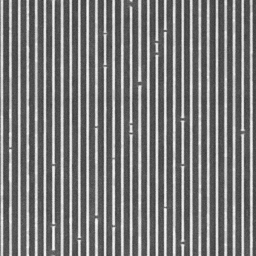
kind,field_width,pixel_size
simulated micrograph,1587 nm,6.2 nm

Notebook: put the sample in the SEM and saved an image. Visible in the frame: parallel lines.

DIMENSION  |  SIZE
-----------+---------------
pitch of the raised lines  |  53.3 nm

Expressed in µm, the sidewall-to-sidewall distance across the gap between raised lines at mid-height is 0.0403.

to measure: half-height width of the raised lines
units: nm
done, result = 11.6